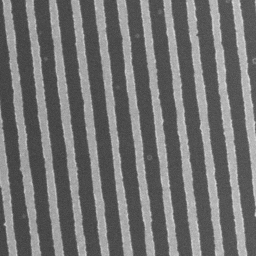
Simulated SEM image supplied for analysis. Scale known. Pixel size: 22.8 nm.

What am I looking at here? parallel lines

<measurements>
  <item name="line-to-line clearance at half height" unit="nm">352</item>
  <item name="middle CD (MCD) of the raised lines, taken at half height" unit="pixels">7.32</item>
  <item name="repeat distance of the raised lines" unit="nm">521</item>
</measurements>